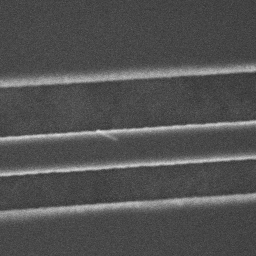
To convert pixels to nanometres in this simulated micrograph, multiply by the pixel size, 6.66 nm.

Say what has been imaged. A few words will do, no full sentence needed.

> lines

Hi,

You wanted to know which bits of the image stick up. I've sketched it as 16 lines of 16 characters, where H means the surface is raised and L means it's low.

HHHHHHHHHHHHHHHH
HHHHHHHHHHHHHHHH
HHHHHHHHHHHHHHHH
HHHHHHHHHHHHHHHH
HHHHHHHHHHHHHHLL
LLLLLLLLLLLLLLLL
LLLLLLLLLLLLLLLL
LLLLLLLLLLLLLLLL
LLHHHHHHHHHHHHHH
HHHHHHHHHHHHHHHH
HHHHHHHLLLLLLLLL
LLLLLLLLLLLLLLLL
LLLLLLLLLLLLHHHH
HHHHHHHHHHHHHHHH
HHHHHHHHHHHHHHHH
HHHHHHHHHHHHHHHH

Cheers